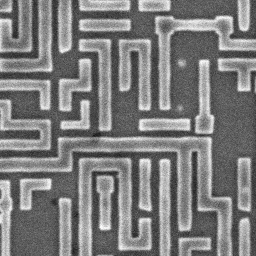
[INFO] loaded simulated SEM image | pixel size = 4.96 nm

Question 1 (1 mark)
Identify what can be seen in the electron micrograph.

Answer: wiring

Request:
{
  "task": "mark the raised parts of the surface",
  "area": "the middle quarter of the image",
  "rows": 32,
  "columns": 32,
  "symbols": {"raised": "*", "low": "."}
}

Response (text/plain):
....***..**...**...***..**......
....***..**...**...**...**......
....***..**...**...**...**......
....***..**...**...**...**......
*******..**...**...**...**......
*******..**...**...**...**......
*******..**...**...**...**......
**.......**........**...**......
**.......**........***..**......
**..**...**........***..**......
**..**...**........**...**......
*...**...**.....................
....**...**.....................
....**...**.....................
******...**........************.
******...**........************.
.........**........**...........
................................
..............................**
********************************
********************************
********************************
**...........................***
**...........................***
**..*************..**...**...***
**..*************..**...**...***
**..********.****..***..**...***
....***.......***..**...**...***
....***.****..***..**...**...***
....***.****..***..**...**...***
....***.****..***..**...**...***
....***.****..***..**...**...***